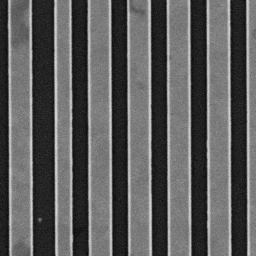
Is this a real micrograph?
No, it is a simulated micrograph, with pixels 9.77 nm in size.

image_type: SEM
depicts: parallel lines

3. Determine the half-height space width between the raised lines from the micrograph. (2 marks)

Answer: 0.174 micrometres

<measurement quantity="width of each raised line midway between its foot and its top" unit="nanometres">214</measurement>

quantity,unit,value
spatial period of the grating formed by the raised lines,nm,388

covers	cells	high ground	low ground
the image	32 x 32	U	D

DUUUDDDUUDDUUUDDUUUDDUUUDDUUUDDU
DUUUDDDUUDDUUUDDUUUDDUUUDDUUUDDU
DUUUDDDUUDDUUUDDUUUDDUUUDDUUUDDU
DUUUDDDUUDDUUUDDUUUDDUUUDDUUUDDU
DUUUDDDUUDDUUUDDUUUDDUUUDDUUUDDU
DUUUDDDUUDDUUUDDUUUDDUUUDDUUUDDU
DUUUDDDUUDDUUUDDUUUDDUUUDDUUUDDU
DUUUDDDUUDDUUUDDUUUDDUUUDDUUUDDU
DUUUDDDUUDDUUUDDUUUDDUUUDDUUUDDU
DUUUDDDUUDDUUUDDUUUDDUUUDDUUUDDU
DUUUDDDUUDDUUUDDUUUDDUUUDDUUUDDU
DUUUDDDUUDDUUUDDUUUDDUUUDDUUUDDU
DUUUDDDUUDDUUUDDUUUDDUUUDDUUUDDU
DUUUDDDUUDDUUUDDUUUDDUUUDDUUUDDU
DUUUDDDUUDDUUUDDUUUDDUUUDDUUUDDU
DUUUDDDUUDDUUUDDUUUDDUUUDDUUUDDU
DUUUDDDUUDDUUUDDUUUDDUUUDDUUUDDU
DUUUDDDUUDDUUUDDUUUDDUUUDDUUUDDU
DUUUDDDUUDDUUUDDUUUDDUUUDDUUUDDU
DUUUDDDUUDDUUUDDUUUDDUUUDDUUUDDU
DUUUDDDUUDDUUUDDUUUDDUUUDDUUUDDU
DUUUDDDUUDDUUUDDUUUDDUUUDDUUUDDU
DUUUDDDUUDDUUUDDUUUDDUUUDDUUUDDU
DUUUDDDUUDDUUUDDUUUDDUUUDDUUUDDU
DUUUDDDUUDDUUUDDUUUDDUUUDDUUUDDU
DUUUDDDUUDDUUUDDUUUDDUUUDDUUUDDU
DUUUDDDUUDDUUUDDUUUDDUUUDDUUUDDU
DUUUDDDUUDDUUUDDUUUDDUUUDDUUUDDU
DUUUDDDUUDDUUUDDUUUDDUUUDDUUUDDU
DUUUDDDUUDDUUUDDUUUDDUUUDDUUUDDU
DUUUDDDUUDDUUUDDUUUDDUUUDDUUUDDU
DUUUDDDUUDDUUUDDUUUDDUUUDDUUUDDU